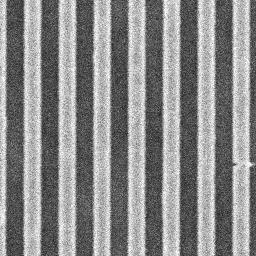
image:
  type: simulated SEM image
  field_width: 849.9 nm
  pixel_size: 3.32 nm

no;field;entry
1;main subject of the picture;parallel lines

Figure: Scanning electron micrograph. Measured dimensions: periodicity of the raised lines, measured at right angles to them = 0.116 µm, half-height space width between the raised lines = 62.7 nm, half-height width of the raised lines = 51.5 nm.